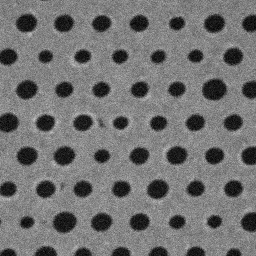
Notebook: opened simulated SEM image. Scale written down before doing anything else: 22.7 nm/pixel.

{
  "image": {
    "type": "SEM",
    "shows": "a regular array of holes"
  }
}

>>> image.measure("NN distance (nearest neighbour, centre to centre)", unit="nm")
846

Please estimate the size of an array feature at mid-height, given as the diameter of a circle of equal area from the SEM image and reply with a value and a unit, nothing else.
430 nm